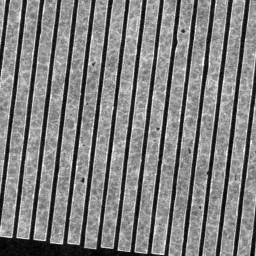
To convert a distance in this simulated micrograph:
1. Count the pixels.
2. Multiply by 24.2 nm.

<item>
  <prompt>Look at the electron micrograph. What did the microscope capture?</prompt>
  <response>parallel lines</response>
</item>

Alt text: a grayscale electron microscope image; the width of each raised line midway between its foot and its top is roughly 289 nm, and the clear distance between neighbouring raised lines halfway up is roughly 114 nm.